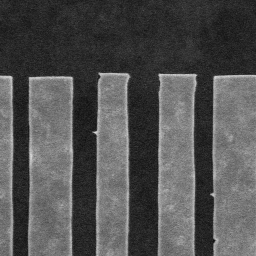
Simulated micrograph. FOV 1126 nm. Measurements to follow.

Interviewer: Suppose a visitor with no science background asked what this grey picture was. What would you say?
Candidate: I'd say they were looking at parallel lines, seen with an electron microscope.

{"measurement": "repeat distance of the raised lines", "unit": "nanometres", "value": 275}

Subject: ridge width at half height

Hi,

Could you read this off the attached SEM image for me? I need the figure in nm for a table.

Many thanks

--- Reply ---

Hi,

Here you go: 160